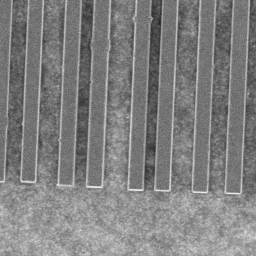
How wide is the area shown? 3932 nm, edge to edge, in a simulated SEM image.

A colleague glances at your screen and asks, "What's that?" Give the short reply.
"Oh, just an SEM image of parallel lines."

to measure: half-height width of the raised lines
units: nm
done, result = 236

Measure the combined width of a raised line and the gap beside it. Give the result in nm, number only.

524